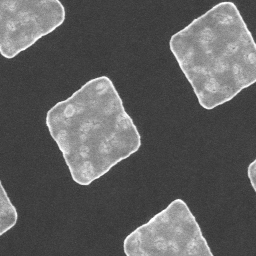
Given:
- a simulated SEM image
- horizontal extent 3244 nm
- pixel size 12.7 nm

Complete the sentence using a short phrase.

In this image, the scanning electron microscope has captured raised bodies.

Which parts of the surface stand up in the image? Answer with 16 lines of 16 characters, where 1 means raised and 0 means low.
1111000000000110
1111000000001110
1100000000011111
1000000000011111
0000000000011111
0000011000001110
0000111100000100
0001111100000000
0001111110000000
0000111100000000
0000111000000000
0000000000000000
1000000000000000
1000000000110000
0000000011111000
0000000011111000